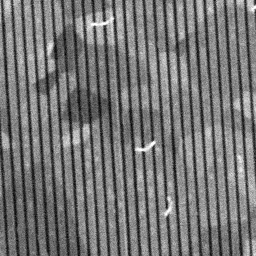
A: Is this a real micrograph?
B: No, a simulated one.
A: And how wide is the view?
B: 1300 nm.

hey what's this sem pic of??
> parallel lines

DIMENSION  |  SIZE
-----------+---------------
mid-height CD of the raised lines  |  0.0323 um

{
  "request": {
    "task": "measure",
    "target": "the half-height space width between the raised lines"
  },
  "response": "3.62 px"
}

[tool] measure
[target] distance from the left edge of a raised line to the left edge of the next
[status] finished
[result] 51.4 nm